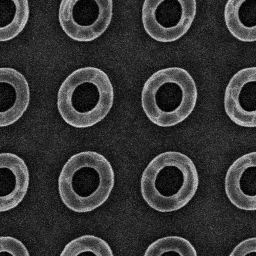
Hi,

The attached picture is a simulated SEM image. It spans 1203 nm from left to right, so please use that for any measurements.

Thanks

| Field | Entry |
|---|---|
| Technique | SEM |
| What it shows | ring-shaped raised bodies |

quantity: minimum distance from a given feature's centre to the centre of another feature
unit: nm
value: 393